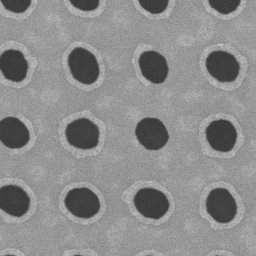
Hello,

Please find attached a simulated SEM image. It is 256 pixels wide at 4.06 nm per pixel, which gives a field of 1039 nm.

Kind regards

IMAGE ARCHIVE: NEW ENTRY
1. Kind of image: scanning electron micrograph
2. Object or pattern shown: a regular array of holes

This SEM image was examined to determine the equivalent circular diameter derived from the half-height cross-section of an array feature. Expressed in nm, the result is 128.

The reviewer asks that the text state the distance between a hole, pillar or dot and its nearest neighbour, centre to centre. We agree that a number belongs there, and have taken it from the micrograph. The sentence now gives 278 nanometres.